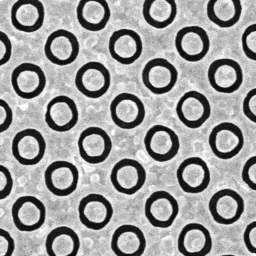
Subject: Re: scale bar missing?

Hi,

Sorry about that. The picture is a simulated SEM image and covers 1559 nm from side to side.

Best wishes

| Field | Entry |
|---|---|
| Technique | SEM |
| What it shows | a regular array of ring-shaped grooves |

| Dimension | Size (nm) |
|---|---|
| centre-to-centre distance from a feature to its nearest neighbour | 274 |